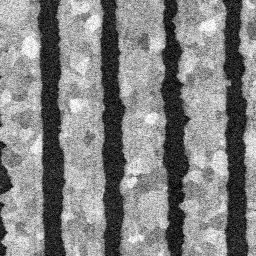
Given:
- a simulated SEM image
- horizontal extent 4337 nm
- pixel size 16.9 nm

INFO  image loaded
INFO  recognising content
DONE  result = one or a few lines or trenches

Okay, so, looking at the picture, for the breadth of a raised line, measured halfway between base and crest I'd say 601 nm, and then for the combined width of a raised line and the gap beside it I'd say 1.03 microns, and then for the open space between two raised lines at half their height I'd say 432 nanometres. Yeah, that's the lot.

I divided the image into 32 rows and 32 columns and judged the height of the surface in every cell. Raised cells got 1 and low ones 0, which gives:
11110000111100011111001111100001
11110000111100011111001111110001
11110000111100011111000111110011
11110000111100011111001111110011
11111000111100011111001111110011
11111000111100011111000111110001
11111000111100011111000111110001
11110000111100011111000111110001
11110000111100011111000111110001
11111000111100011111000111110001
11111000111100011111000111110001
11111000111110011111000111110001
11111000111100001111000111110001
11111000111100001111000011110001
11111000111100001111000011110001
01111000111100001111000011110001
11111000111100001111000011110001
11111000111100001111000111110001
01111000111100001111000011110001
01111000111100001111000011110001
01111000011100001111000011110001
01111000011100001111000011110001
00111000011110001111000011110001
00111000111110001111000111110001
01111000111100001111100111110001
01111000111100001111000111110001
11111000111110001111000011110001
01111000111110001111000111110001
01111000111110001111000111110001
01111000111100001111100111110001
01111000111110001111000111110001
01111000011110001111100111110001